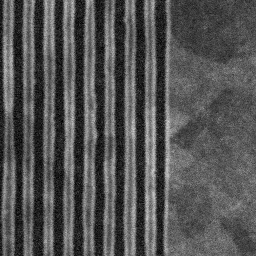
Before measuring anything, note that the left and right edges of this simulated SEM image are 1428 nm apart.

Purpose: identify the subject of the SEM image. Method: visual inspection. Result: parallel lines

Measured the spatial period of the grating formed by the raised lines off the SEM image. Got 113 nanometers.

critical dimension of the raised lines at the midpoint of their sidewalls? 7.11 pixels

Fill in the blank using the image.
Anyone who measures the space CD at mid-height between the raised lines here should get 74.6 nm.